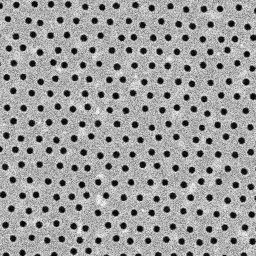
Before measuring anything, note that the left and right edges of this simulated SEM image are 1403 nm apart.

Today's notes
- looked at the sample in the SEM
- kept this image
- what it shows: a regular array of holes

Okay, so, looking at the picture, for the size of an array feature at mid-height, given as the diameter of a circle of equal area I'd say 36.6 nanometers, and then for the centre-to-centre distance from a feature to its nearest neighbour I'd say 80.8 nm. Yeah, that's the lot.